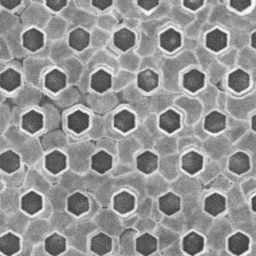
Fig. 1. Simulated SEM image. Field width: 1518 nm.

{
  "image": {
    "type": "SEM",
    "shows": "a regular array of holes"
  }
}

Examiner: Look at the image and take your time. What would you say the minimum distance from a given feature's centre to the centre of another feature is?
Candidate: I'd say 0.269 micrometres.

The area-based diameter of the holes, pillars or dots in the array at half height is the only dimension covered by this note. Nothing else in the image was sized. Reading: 0.14 micrometres